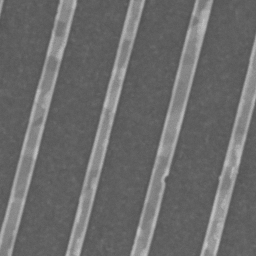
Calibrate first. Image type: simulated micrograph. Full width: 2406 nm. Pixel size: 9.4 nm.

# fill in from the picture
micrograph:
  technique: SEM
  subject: one or a few lines or trenches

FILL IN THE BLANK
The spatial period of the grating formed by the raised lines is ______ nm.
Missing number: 621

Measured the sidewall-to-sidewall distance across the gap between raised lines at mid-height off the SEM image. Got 0.512 microns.